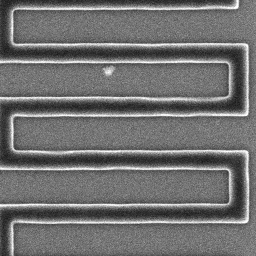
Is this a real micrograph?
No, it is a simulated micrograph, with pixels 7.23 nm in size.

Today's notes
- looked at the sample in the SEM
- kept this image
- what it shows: groups of lines, slits or small figures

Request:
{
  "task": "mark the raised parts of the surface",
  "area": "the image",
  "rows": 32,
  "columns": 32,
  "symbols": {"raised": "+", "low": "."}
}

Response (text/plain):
++++++++++++++++++++++++++++++..
++..............................
+...............................
+...............................
+...............................
++..............................
+++++++++++++++++++++++++++++++.
+++++++++++++++++++++++++++++++.
.............................++.
.............................++.
.............................++.
.............................++.
+++++++++++++++++++++++++++++++.
+++++++++++++++++++++++++++++++.
++..............................
+...............................
++..............................
++..............................
++..............................
+++++++++++++++++++++++++++++++.
+++++++++++++++++++++++++++++++.
.............................++.
.............................++.
.............................++.
.............................++.
............................+++.
+++++++++++++++++++++++++++++++.
+++++++++++++++++++++++++++++++.
+...............................
++..............................
++..............................
++..............................